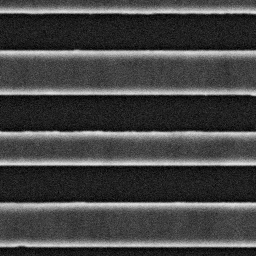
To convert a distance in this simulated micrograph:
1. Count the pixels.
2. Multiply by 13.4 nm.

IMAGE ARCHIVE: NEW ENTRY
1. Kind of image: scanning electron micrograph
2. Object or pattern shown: lines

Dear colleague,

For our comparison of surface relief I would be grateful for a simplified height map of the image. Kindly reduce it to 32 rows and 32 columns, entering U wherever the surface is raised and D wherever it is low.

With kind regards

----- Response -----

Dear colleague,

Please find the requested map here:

UUUUUUUUUUUUUUUUUUUUUUUUUUUUUUUU
UUUUUUUUUUUUUUUUUUUUUUUUUUUUUUUU
DDDDDDDDDDDDDDDDDDDDDDDDDDDDDDDD
DDDDDDDDDDDDDDDDDDDDDDDDDDDDDDDD
DDDDDDDDDDDDDDDDDDDDDDDDDDDDDDDD
DDDDDDDDDDDDDDDDDDDDDDDDDDDDDDDD
DDDDDDDDDUDDDDDDDDDDDDDDDDDDDDDD
UUUUUUUUUUUUUUUUUUUUUUUUUUUUUUUU
UUUUUUUUUUUUUUUUUUUUUUUUUUUUUUUU
UUUUUUUUUUUUUUUUUUUUUUUUUUUUUUUU
UUUUUUUUUUUUUUUUUUUUUUUUUUUUUUUU
UUUUUUUUUUUUUUUUUUUUUUUUUUUUUUUU
DDDDDDDDDDDDDDDDDDDDDDDDDDDDDDDD
DDDDDDDDDDDDDDDDDDDDDDDDDDDDDDDD
DDDDDDDDDDDDDDDDDDDDDDDDDDDDDDDD
DDDDDDDDDDDDDDDDDDDDDDDDDDDDDDDD
DDDDDDDDDDDDUDDDDDDDDDDDDDDDDDDD
UUUUUUUUUUUUUUUUUUUUUUUUUUUUUUUU
UUUUUUUUUUUUUUUUUUUUUUUUUUUUUUUU
UUUUUUUUUUUUUUUUUUUUUUUUUUUUUUUU
UUUUUUUUUUUUUUUUUUUUUUUUUUUUUUUU
DDDDDDDDDDDDDDDDDDDDDDDDDDDDDDDD
DDDDDDDDDDDDDDDDDDDDDDDDDDDDDDDD
DDDDDDDDDDDDDDDDDDDDDDDDDDDDDDDD
DDDDDDDDDDDDDDDDDDDDDDDDDDDDDDDD
DDDDDDDDUUUUUUUUUUUUUUUUUUUUUUUU
UUUUUUUUUUUUUUUUUUUUUUUUUUUUUUUU
UUUUUUUUUUUUUUUUUUUUUUUUUUUUUUUU
UUUUUUUUUUUUUUUUUUUUUUUUUUUUUUUU
UUUUUUUUUUUUUUUUUUUUUUUUUUUUUUUU
UUUUUUUUUUUUUUUUUUUUUUUUUUUUUUUU
DDDDDDDDDDDDDDDDDDDDDDDDDDDDDDDD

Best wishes